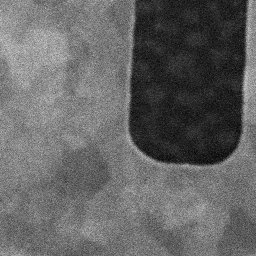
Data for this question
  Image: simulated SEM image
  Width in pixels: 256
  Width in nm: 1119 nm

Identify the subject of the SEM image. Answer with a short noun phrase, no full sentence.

one or a few lines or trenches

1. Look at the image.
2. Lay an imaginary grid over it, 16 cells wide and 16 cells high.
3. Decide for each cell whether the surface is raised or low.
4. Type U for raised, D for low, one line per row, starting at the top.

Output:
UUUUUUUUDDDDDDDD
UUUUUUUUDDDDDDDU
UUUUUUUUDDDDDDDU
UUUUUUUUDDDDDDDU
UUUUUUUUDDDDDDDU
UUUUUUUUDDDDDDDU
UUUUUUUUDDDDDDDU
UUUUUUUUDDDDDDDU
UUUUUUUUDDDDDDDU
UUUUUUUUUDDDDDDU
UUUUUUUUUUUUUUUU
UUUUUUUUUUUUUUUU
UUUUUUUUUUUUUUUU
UUUUUUUUUUUUUUUU
UUUUUUUUUUUUUUUU
UUUUUUUUUUUUUUUU